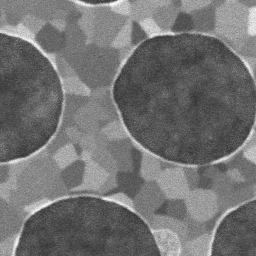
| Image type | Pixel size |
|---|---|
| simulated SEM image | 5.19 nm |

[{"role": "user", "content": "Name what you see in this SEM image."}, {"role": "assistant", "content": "holes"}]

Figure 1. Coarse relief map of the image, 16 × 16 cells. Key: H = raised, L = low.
HHHHHHHHHHHHHHHH
HHHHHHHHHHHHHHHH
LLHHHHHHHLLLLLHH
LLLHHHHHLLLLLLLH
LLLLHHHLLLLLLLLL
LLLLHHHLLLLLLLLL
LLLLHHHLLLLLLLLL
LLLLHHHHLLLLLLLL
LLLHHHHHLLLLLLLL
LLHHHHHHHLLLLLLH
HHHHHHHHHHHHHHHH
HHHHHHHHHHHHHHHH
HHHHLLLHHHHHHHHH
HHLLLLLLLHHHHHLL
HLLLLLLLLLLHHLLL
HLLLLLLLLLLHHLLL